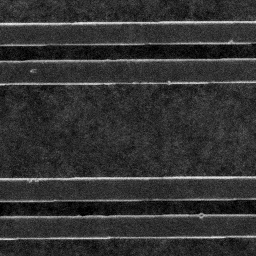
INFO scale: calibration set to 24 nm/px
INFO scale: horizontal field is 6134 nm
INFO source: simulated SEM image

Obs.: lines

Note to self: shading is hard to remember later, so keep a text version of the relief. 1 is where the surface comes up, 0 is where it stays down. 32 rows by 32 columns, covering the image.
00000000000000000000000000000000
00000000000000000000000000000000
00000000000000000000000000000000
11111111111111111111111111111111
11111111111111111111111111111111
11111111111111111000000000000000
00000000000000000000000000000000
00000000000000000111111111111111
11111111111111111111111111111111
11111111111111111111111111111111
00000000000000000000000000000000
00000000000000000000000000000000
00000000000000000000000000000000
00000000000000000000000000000000
00000000000000000000000000000000
00000000000000000000000000000000
00000000000000000000000000000000
00000000000000000000000000000000
00000000000000000000000000000000
00000000000000000000000000000000
00000000000000000000000000000000
00000000000000000000000000000000
11111111111111111111111111111111
11111111111111111111111111111111
11111111111111111111111111111111
00000000000000000000000000000000
00000000000000000000000000000000
11111111111111111111111111111111
11111111111111111111111111111111
11111111111111111111111111111111
00000000000000000000000000000000
00000000000000000000000000000000